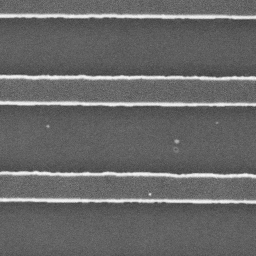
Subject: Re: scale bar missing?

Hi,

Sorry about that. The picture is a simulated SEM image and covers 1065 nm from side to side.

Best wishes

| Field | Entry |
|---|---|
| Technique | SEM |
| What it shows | lines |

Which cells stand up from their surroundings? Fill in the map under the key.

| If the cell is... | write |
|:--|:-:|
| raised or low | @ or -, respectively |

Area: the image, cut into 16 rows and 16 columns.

@@@@@@@@@@@@@@@@
----------------
----------------
----------------
----------------
@@@@@@@@@@@@@@@@
--@@@@@@@@@@@@@@
----------------
----------------
----------------
----------------
@@@@@@@@@@@@@@@@
@@@@@@@@@@@@@@@@
----------------
----------------
----------------